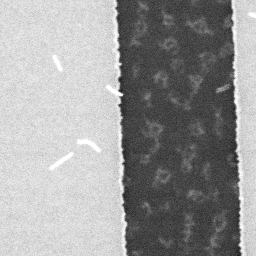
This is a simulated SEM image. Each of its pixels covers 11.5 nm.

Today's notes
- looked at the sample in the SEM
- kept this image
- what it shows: one or a few lines or trenches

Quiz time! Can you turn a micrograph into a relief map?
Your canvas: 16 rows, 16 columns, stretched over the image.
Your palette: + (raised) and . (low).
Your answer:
+++++++........+
+++++++........+
+++++++........+
+++++++........+
+++++++........+
+++++++........+
+++++++........+
+++++++........+
++++++++.......+
++++++++.......+
++++++++.......+
++++++++.......+
++++++++.......+
++++++++.......+
++++++++.......+
++++++++.......+